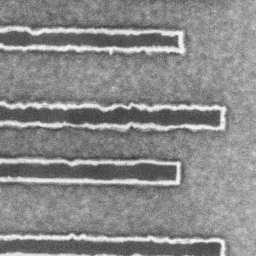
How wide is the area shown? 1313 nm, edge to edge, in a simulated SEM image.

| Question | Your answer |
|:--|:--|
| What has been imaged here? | one or a few lines or trenches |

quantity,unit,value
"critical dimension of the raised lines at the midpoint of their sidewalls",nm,104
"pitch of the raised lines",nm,338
